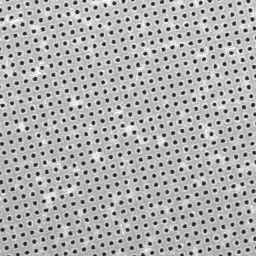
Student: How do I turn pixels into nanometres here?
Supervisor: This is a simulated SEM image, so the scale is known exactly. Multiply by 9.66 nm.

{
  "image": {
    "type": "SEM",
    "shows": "a regular array of holes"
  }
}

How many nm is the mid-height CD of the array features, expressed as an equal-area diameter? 42.2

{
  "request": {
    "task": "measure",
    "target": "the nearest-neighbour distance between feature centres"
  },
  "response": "87.7 nm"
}